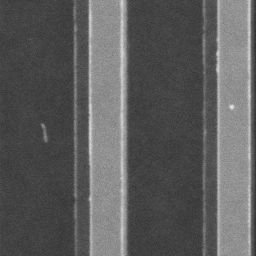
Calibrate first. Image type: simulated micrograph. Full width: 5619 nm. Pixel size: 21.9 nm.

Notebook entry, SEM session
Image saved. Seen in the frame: lines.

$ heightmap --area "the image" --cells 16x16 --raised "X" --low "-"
-----XXX-----XXX
-----XXX-----XXX
-----XXX-----XXX
-----XXX-----XXX
-----XXX-----XXX
-----XXX-----XXX
-----XXX-----XXX
-----XXX-----XXX
-----XXX-----XXX
-----XXX-----XXX
-----XXX-----XXX
-----XXX-----XXX
-----XXX-----XXX
-----XXX-----XXX
-----XXX-----XXX
-----XXX-----XXX